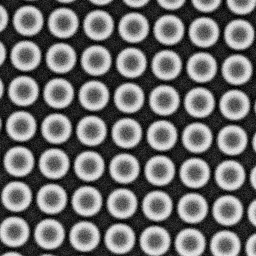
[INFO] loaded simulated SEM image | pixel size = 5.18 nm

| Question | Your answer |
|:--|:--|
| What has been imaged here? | an array of small figures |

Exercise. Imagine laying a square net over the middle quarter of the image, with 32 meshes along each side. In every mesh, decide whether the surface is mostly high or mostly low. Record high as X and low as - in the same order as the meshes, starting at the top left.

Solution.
XX---XXXXXX--XXXXXXX--XXXXXXX--X
X----XXXXXX---XXXXXX--XXXXXXX--X
-------XX-----XXXXX----XXXXXX--X
------------------------XXX-----
X-----XXX-----------------------
XX---XXXXX----XXXX--------------
XX--XXXXXXX--XXXXXX---XXXXXX----
XX--XXXXXXX--XXXXXXX--XXXXXX---X
XX--XXXXXXX--XXXXXXX--XXXXXXX-XX
XX--XXXXXXX--XXXXXXX--XXXXXXX-XX
X----XXXXX---XXXXXX---XXXXXX--XX
-------X------XXXX----XXXXXX---X
------------------------XXX-----
X----XXXX-----------------------
X---XXXXXX---XXXXX-----XXX------
XX-XXXXXXX---XXXXXX---XXXXX----X
XX-XXXXXXX--XXXXXXX--XXXXXXX--XX
XX-XXXXXXX--XXXXXXX--XXXXXXX--XX
X---XXXXXX--XXXXXXX--XXXXXXX--XX
----XXXXX----XXXXXX--XXXXXXX--XX
--------------XXX-----XXXXX---XX
------------------------X------X
----XXXX------------------------
X--XXXXXX----XXXXX----XXXX------
X--XXXXXXX--XXXXXX---XXXXXX---XX
X--XXXXXXX--XXXXXXX-XXXXXXX---XX
X--XXXXXXX--XXXXXXX-XXXXXXXX-XXX
---XXXXXX---XXXXXXX-XXXXXXX--XXX
----XXXX----XXXXXX---XXXXXX--XXX
--------------XX------XXXX----XX
-------------------------------X
---XXXXX-----XXX----------------